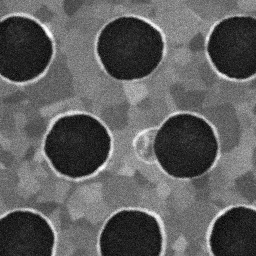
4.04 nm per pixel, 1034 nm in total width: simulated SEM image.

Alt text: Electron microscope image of holes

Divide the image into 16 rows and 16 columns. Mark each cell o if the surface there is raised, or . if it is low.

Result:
oooooooooooooooo
..ooooo..ooooo..
...ooo....ooo...
...ooo....ooo...
...oooo..ooooo..
oooooooooooooooo
oooooooooooooooo
oooo..oooo...ooo
ooo....oo....ooo
ooo....oo.....oo
ooo...oooo...ooo
oooooooooooooooo
oooooooooooooooo
...oooo..ooooo..
...ooo....ooo...
...ooo....ooo...